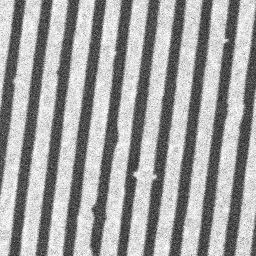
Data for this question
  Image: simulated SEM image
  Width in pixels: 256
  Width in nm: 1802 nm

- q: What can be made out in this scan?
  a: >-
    parallel lines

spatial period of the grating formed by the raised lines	188	nm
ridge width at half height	104	nanometers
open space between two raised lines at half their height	11.8	px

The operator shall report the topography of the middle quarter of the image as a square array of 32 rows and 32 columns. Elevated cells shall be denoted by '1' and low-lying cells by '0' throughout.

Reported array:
00111100011100011110001111000111
00111000111100011110001110000111
00111000111100011110001110001111
00111000111100011100001110001111
01111000111100011100001110001111
01111000111100011100001110001111
01111000111100011100011110001111
01111000111100111100011110001111
01110000111000111100011100001110
01110001111000111000011100001110
11110001111000111000011100001110
11110001111000111000011100011110
11110001111000111000011100011110
11110001111000111000011100011110
11110001111001111000111100011110
11110001110000111000111100011110
11100001110000111000111000011100
11100011110000111000111000011100
11100011110000111000111000011100
11100011110000110000111000111100
11100011110001110001111000111100
11100011100001110001111000111100
11100011100001110001111000111100
11100011100011110001111000111000
11000011100011110001110000111000
11000111100011110001110000111000
11000111100011110001110000111000
11000111100011100011110001111000
11000111100011100011111001111000
11000111000011100011110001110000
11000111000111100011110001111000
11000111000111100011110001110000